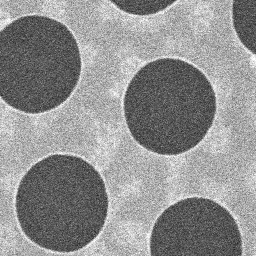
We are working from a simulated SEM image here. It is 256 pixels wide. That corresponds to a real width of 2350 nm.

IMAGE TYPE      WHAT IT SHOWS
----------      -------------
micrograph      holes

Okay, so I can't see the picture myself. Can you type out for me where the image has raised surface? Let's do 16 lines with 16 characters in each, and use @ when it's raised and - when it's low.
@@@@@@@---@@@@@-
@---@@@@@@@@@@@-
-----@@@@@@@@@@-
-----@@@@@@@@@@@
-----@@@@----@@@
-----@@@-----@@@
----@@@@------@@
@@@@@@@@-----@@@
@@@@@@@@-----@@@
@@@@@@@@@@--@@@@
@@----@@@@@@@@@@
@------@@@@@@@@@
@------@@@@--@@@
@------@@@-----@
@-----@@@------@
@@@--@@@@------@